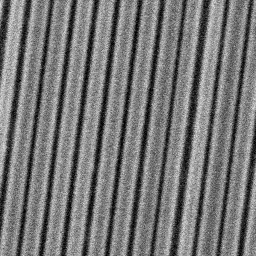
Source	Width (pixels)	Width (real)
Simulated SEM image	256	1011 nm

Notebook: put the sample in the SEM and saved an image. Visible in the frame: parallel lines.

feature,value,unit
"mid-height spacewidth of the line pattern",0.0244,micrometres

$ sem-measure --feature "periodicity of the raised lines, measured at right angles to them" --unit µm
0.0865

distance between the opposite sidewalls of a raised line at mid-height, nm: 63.2